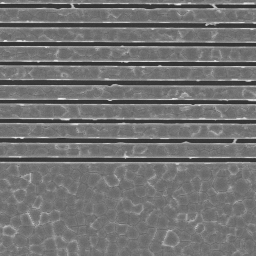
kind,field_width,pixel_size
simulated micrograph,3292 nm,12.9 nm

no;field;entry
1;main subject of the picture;parallel lines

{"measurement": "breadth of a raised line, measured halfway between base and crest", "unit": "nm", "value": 188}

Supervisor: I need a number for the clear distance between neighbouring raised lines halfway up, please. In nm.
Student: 49.8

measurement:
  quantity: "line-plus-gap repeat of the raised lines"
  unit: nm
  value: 248